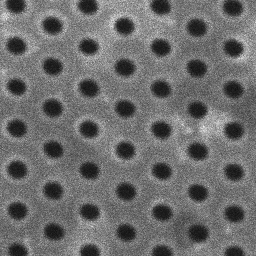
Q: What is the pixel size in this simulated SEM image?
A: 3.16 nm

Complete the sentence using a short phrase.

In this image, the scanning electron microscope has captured a regular array of holes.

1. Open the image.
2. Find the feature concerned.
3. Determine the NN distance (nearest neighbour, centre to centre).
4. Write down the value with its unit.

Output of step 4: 130 nm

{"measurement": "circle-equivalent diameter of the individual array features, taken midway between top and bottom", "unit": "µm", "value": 0.0611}